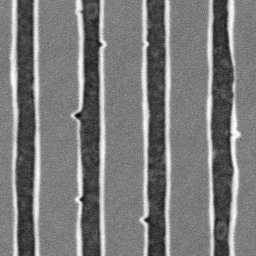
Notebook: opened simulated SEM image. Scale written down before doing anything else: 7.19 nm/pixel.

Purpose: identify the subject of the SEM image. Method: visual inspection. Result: one or a few lines or trenches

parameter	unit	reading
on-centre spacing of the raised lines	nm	470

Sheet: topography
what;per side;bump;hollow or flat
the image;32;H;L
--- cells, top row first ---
HHLLHHHHHHLLLHHHHHLLLHHHHHLLLHHH
HHLLHHHHHHLLLHHHHHLLLHHHHHLLLHHH
HHLLLHHHHHLLLHHHHHLLLHHHHHLLLHHH
HHLLLHHHHHLLLHHHHHLLLHHHHHLLLHHH
HHLLLHHHHHLLLHHHHHLLLHHHHHLLLHHH
HHLLLHHHHHLLLHHHHHLLLHHHHHLLLHHH
HHLLLHHHHHLLLHHHHHLLLHHHHHLLLHHH
HHLLLHHHHHLLLHHHHHLLLHHHHHLLLHHH
HHLLLHHHHHLLLHHHHHLLLHHHHHLLLHHH
HHLLLHHHHHLLLHHHHHLLLHHHHHLLLHHH
HHLLLHHHHHLLLHHHHHLLLHHHHHLLLHHH
HHLLLHHHHHLLLHHHHHLLLHHHHHLLLHHH
HHLLLHHHHHLLLHHHHHLLLHHHHHLLLHHH
HHLLLHHHHHLLLHHHHHLLLHHHHHLLLHHH
HHLLLHHHHLLLLHHHHHLLLHHHHHLLLHHH
HHLLLHHHHHLLLHHHHHLLLHHHHHLLLHHH
HHLLLHHHHHLLLHHHHHLLLHHHHHLLLHHH
HHLLLHHHHHLLLHHHHHLLLHHHHHLLLHHH
HHLLLHHHHHLLLHHHHHLLLHHHHHLLLHHH
HHLLLHHHHHLLLHHHHHLLLHHHHHLLLHHH
HHLLLHHHHHLLLHHHHHLLLHHHHHLLLHHH
HHLLLHHHHHLLLHHHHHLLLHHHHHLLLHHH
HHLLLHHHHHLLLHHHHHLLLHHHHHLLLHHH
HHLLHHHHHHLLLHHHHHLLLHHHHHLLLHHH
HHLLHHHHHHLLLHHHHHLLLHHHHHHLLHHH
HHLLHHHHHHLLLHHHHHLLLHHHHHHLLHHH
HHLLHHHHHHLLLHHHHHLLLHHHHHHLLHHH
HHLLHHHHHHLLLHHHHHLLLHHHHHHLLHHH
HHLLLHHHHHLLLHHHHHLLLHHHHHHLLHHH
HHLLLHHHHHLLLHHHHHLLLHHHHHHLLHHH
HHLLLHHHHHLLLHHHHHLLLHHHHHHLLHHH
HHLLLHHHHHLLLHHHHHLLLHHHHHHLLHHH